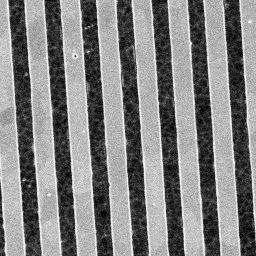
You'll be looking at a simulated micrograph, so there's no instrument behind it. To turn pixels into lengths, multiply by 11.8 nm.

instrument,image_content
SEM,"parallel lines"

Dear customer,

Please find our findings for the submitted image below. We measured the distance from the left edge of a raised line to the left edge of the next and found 0.423 micrometres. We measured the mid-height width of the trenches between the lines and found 192 nanometres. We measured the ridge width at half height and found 226 nanometers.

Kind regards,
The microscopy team